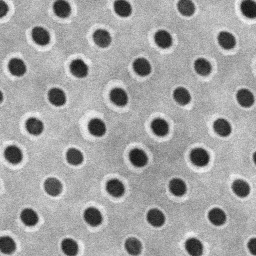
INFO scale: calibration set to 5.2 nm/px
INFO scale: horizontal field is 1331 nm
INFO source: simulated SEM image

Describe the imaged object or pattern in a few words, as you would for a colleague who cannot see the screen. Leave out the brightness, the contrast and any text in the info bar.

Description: a regular array of holes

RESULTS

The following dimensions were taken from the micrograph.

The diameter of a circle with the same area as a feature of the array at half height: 0.112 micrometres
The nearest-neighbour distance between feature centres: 192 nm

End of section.